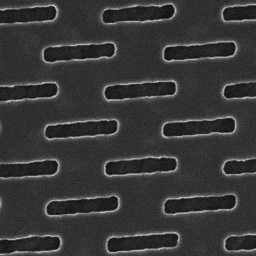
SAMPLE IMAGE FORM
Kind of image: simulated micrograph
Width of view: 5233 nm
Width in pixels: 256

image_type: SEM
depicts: a regular array of holes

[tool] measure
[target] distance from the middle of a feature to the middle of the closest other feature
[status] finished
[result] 1430 nanometers